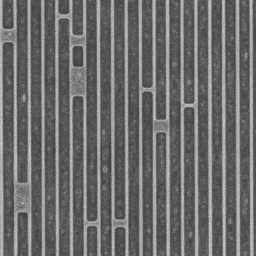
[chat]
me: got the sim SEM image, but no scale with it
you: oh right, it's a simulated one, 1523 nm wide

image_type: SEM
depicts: parallel lines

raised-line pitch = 82.7 nm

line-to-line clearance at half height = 65.5 nanometers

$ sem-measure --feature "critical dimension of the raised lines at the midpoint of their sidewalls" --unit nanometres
17.9